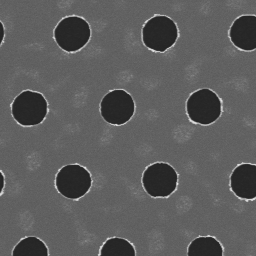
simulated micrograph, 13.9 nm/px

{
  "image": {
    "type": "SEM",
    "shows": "holes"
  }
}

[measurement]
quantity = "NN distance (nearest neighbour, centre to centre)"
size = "1190 nm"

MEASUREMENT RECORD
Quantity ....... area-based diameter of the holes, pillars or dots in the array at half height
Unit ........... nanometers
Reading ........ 486